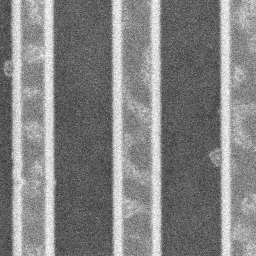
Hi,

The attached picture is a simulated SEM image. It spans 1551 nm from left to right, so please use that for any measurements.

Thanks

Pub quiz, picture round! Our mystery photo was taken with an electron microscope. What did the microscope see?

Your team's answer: one or a few lines or trenches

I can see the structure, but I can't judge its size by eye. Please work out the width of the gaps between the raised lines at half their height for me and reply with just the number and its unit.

415 nanometres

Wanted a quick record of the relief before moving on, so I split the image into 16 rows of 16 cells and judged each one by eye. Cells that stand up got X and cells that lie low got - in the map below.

-XX----XXX----XX
-XX----XXX----XX
-XX----XXX----XX
-XX----XXX----XX
-XX----XXX----XX
-XX----XXX----XX
-XX----XXX----XX
-XX----XXX----XX
-XX----XXX----XX
-XX----XXX----XX
-XX----XXX----XX
-XX----XXX----XX
-XX----XXX----XX
-XX----XXX----XX
-XX----XXX----XX
-XX----XXX----XX